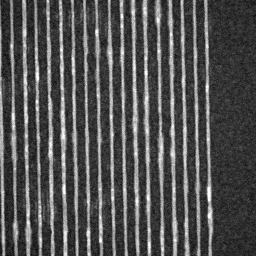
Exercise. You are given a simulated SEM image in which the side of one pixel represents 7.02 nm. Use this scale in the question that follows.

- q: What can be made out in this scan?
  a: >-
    parallel lines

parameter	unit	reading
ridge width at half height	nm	16.7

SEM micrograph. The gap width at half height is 0.0684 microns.